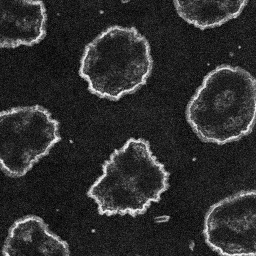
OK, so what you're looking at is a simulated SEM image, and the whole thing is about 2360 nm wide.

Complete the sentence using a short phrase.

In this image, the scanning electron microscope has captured raised bodies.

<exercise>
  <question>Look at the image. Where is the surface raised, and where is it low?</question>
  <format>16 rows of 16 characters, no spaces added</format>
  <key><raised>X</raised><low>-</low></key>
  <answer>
XXX--------XXXX-
XXX---------X---
XX----XXX-------
-----XXXX-------
-----XXXX----XX-
------XX-----XXX
------------XXXX
XXX---------XXXX
XXX----------XX-
XXX----XX-------
XX-----XXX------
------XXXX------
------XXXX----XX
-------------XXX
-XX----------XXX
XXXX---------XXX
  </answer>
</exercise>